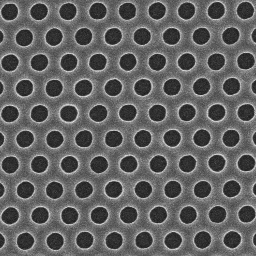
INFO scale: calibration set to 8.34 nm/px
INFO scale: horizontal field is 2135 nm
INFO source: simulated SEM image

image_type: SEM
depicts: a regular array of holes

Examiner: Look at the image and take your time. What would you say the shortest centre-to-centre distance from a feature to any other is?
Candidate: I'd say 243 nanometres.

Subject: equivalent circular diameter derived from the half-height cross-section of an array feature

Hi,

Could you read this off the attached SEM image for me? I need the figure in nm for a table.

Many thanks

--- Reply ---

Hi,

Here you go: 146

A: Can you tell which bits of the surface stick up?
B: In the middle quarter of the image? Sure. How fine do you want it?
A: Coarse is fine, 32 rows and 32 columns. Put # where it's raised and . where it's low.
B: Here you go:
...###....####....###....####...
..#####...#####..#####..######.#
################################
################################
####...####...####....###....###
###....###.....##.....###....###
###....###....###.....###....###
###...#####...####...#####..####
################################
################################
..######..#####..#####...####...
...####....###....###.....###...
...###.....###....###.....###...
...####....###....###....####...
#.######.#######################
################################
############.######.######..####
###....####...####....###....###
###....###.....###....###....###
###....###....####....###....###
####..#####...####...#####..####
################################
################################
...####...#####...####...####...
...####....###....###.....###...
....##.....###....###.....###...
...####....####...####...####...
################################
################################
####..#####...#####..#####..####
###....###.....###....###....###
###....###.....###....###....###